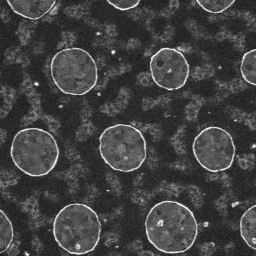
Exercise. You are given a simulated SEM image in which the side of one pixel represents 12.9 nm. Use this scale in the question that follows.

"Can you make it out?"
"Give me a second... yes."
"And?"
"raised bodies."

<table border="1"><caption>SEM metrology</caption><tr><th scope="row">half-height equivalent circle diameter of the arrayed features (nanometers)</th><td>597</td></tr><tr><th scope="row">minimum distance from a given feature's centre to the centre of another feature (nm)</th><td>1150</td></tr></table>